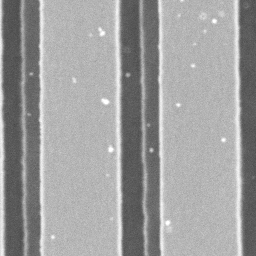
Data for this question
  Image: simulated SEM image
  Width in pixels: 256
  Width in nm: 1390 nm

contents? lines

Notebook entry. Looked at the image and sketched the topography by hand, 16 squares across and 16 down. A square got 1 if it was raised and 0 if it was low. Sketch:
0011111000111110
0001111000111110
0011111000111110
0011111000111110
0011111000111110
0001111000111110
0011111000111110
0011111000111110
0001111000111110
0001111000111110
0001111000111110
0001111000111110
0001111100111110
0001111100111110
0001111100111110
0001111100111110